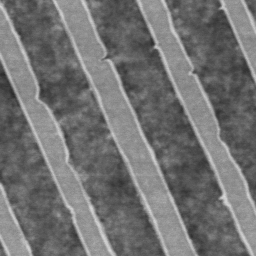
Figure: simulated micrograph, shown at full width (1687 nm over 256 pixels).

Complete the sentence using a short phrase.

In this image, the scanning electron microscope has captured one or a few lines or trenches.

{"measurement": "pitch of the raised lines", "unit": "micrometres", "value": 0.49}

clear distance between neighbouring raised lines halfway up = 0.337 µm